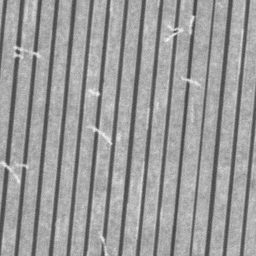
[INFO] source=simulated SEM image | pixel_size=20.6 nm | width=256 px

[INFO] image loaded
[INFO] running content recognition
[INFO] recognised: parallel lines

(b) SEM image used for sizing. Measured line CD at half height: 251 nanometers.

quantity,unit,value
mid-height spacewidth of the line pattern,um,0.115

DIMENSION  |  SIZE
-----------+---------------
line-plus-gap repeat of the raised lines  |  355 nm